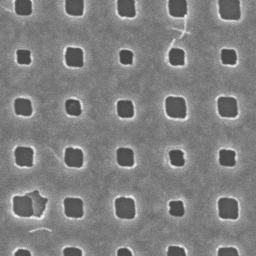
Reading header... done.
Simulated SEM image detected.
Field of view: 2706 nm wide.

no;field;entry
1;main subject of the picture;a regular array of holes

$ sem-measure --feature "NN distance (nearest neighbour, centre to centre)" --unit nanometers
532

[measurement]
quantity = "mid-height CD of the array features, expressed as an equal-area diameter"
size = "19.3 pixels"